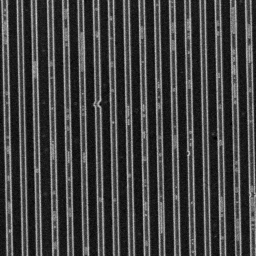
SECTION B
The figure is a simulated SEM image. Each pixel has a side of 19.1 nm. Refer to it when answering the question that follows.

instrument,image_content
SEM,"parallel lines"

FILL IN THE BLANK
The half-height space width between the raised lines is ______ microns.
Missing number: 0.183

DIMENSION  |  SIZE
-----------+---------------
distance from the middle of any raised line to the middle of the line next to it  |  290 nanometres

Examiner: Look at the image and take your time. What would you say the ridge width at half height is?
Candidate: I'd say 4.87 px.